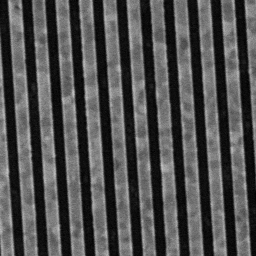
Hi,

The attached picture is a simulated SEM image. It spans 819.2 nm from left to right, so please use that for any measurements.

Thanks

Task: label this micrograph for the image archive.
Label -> parallel lines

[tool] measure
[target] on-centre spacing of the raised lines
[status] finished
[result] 75.5 nm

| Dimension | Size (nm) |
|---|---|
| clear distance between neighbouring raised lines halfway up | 35.5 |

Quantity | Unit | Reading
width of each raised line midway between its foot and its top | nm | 37.9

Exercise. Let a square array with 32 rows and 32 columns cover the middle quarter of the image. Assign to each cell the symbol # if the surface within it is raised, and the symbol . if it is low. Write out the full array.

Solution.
##...###...###...###...###...###
##...###...###...###...###...###
##...###...###...###...###...###
##...###...###...###...###...###
##...###...###...###...###...###
##...###...###...###...###...###
##...###...###...###...###...###
##...###....##...###...###...###
###..###....##....##...###...###
###...##....##....##...###...###
###...###...##....##...###...###
###...###...###...##...###...###
###...###...###...###...##...###
###...###...###...###...###...##
###...###...###...###...###...##
###...###...###...###...###...##
###...###...###...###...###...##
###...###...###...###...###...##
###...###...###...###...###...##
###...###...###...###...###...##
###...###...###...###...###...##
.##...###...###...###...###...##
.###..###...###...###...###...##
.##...###....##...###...###...##
.##....##....##....##...###...##
.###...##....##....##...###...##
.###...###...##....##...###...##
.###...###...###...###...##...##
.###...###...###...###...###..##
.###...###...###...###...###...#
.###...###...###...###...###...#
.###...###...###...###...###...#